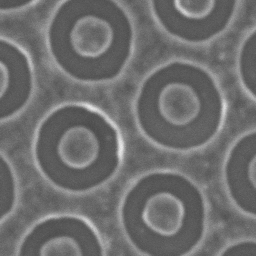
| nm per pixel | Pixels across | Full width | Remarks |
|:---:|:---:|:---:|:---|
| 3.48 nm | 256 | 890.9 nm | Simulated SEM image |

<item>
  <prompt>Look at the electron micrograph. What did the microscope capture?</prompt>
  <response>ring-shaped grooves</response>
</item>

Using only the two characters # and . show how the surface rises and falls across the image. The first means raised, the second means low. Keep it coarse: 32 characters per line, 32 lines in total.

...#####.......####...#####..###
#######........####....###...###
#######...###...####.........###
######...#####..#####.......####
######...#####...#####.....####.
.#####...#####..##############..
...###....###...##############..
...####.........##############..
#...####.......#####.....#####..
#...#####......####.......####..
#...##############.........####.
....##############..####...####.
...##############...#####...####
...#####...######...#####...####
.#####.......####....###....####
#####.........###.....#....#####
#####...###...####.........#####
#####...####...####.......####..
####...#####...######...#####...
#####...####...##############...
.####...###....#############...#
.####.........##############...#
..####.......####......#####...#
..######....#####........####...
..##############...###...####...
..#############...#####..#####..
.##############...#####..######.
######....#####...#####...######
####.......#####...###...#######
###.........####.........#######
###...####...####........####...
##...#####...#####......####....